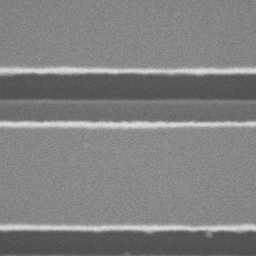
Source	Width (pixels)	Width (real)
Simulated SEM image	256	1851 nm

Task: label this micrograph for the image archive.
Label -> lines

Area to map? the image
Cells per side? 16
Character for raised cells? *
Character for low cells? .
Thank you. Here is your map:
****************
****************
****************
****************
****************
................
................
................
****************
****************
****************
****************
****************
****************
................
................